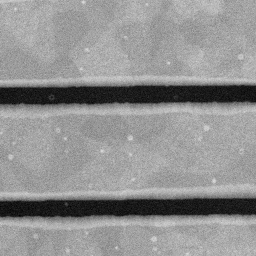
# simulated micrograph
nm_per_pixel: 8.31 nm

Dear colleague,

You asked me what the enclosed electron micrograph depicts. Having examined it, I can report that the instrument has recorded lines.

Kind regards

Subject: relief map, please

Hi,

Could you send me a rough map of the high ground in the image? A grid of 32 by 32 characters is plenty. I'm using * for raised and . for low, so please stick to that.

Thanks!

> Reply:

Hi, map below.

********************************
********************************
********************************
********************************
********************************
********************************
********************************
********************************
********************************
********************************
***********.....................
................................
................................
..*...**************************
********************************
********************************
********************************
********************************
********************************
********************************
********************************
********************************
********************************
********************************
*****************...............
................................
................................
*****......*********************
********************************
********************************
********************************
********************************